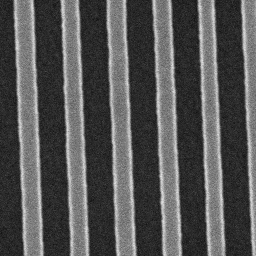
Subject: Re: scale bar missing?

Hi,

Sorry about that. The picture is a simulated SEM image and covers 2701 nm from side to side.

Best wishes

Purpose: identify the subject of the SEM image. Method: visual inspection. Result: lines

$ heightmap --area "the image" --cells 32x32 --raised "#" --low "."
..##....##...###...##....##...##
..##....##...###...##....##...##
..##....##...###...##....##...##
..##....##...###...##....##...##
..##....##....##...###...##...##
..##....##....##...###...##...##
..##....##....##...###...##...##
..##....##....##...###...##....#
..###...##....##...###...##....#
..###...##....##....##...##....#
..###...##....##....##...##....#
..###...##....##....##...##....#
..###...##....##....##...##....#
..###...##....##....##...##....#
..###...##....##....##...##....#
..###...##....##....##...##....#
..###...##....##....##...##....#
..###...###...##....##....#....#
...##...###...##....##....#....#
...##...###...##....##....#....#
...##...###...##....##....##...#
...##...###...##....##....##...#
...##....##...##....##....##...#
...##....##...###...##....##...#
...##....##...###...##....##...#
...##....##...###...##....##...#
...##....##...###...##....##...#
...##....##...###...###...##...#
...##....##...###...###...##...#
...##....##....##...###...##...#
...##....##....##...###...##....
...##....##....##...###...##....